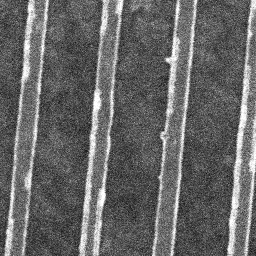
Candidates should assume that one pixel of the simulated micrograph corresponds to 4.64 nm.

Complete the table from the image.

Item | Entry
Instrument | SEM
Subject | one or a few lines or trenches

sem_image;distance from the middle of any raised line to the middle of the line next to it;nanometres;342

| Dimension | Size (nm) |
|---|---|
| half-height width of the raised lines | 84.9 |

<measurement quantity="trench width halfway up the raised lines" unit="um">0.258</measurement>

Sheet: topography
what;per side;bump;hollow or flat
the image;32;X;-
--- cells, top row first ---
----XX-------XX-------XX-------X
----XX-------XX-------XX-------X
----XX-------XX-------XX-------X
---XXX-------XX-------XX-------X
---XXX-------XX-------XX-------X
---XX--------XX-------XX-------X
---XX-------XXX-------XX-------X
---XX-------XXX------XXX-------X
---XX-------XX-------XXX-------X
---XX-------XX-------XXX-------X
---XX-------XX-------XXX-------X
---XX-------XX-------XX-------XX
---XX-------XX-------XX-------XX
--XXX-------XX-------XX-------XX
--XXX-------XX-------XX-------XX
--XXX-------XX-------XX-------XX
--XX-------XXX------XXX-------XX
--XX-------XXX------XXX-------XX
--XX-------XXX------XXX-------XX
--XX-------XX-------XXX-------XX
--XX-------XX-------XXX------XXX
--XX-------XX-------XXX------XXX
--XX-------XX-------XX-------XXX
--XX-------XX-------XX-------XXX
--XX-------XX-------XX-------XX-
-XXX-------XX-------XX-------XX-
-XX--------XX-------XX-------XX-
-XX-------XXX-------XX-------XX-
-XX-------XXX------XXX-------XX-
-XX-------XX-------XXX-------XX-
-XX-------XX-------XXX-------XX-
-XX-------XX-------XXX-------XX-